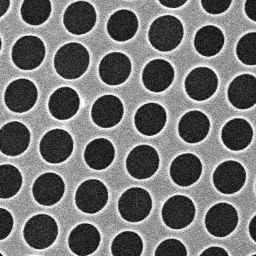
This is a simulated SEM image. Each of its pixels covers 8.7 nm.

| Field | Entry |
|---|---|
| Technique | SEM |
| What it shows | a regular array of holes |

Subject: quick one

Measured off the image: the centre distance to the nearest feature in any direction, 376 nanometres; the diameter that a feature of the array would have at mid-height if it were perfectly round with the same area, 297 nm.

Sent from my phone